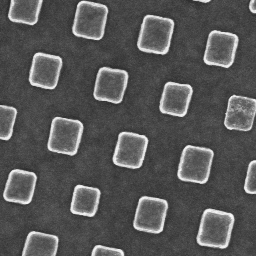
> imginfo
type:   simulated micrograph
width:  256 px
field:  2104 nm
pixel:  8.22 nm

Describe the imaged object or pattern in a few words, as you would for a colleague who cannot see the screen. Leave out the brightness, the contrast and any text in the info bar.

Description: a regular array of raised bodies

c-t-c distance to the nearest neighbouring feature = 546 nm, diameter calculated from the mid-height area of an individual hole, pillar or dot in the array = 34 pixels